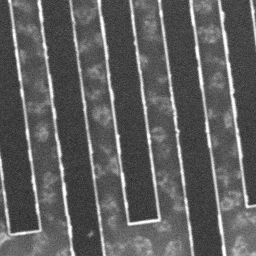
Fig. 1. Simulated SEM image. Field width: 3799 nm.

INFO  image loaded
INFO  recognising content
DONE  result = parallel lines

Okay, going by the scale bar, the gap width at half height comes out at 0.405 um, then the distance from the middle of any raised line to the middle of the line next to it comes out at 59.6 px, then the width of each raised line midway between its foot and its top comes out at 0.476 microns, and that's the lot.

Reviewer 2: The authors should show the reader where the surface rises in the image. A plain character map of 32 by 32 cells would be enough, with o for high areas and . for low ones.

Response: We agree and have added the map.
o....oooo...oooo....oooo...oooo.
o....oooo...ooooo...oooo....oooo
oo...oooo....oooo...oooo....oooo
oo...oooo....oooo...oooo....oooo
oo...oooo....oooo...ooooo...oooo
oo....oooo...oooo....oooo...oooo
oo....oooo...oooo....oooo...oooo
oo....oooo...oooo....oooo...oooo
oo....oooo...oooo....oooo...oooo
ooo...oooo...ooooo...oooo....ooo
ooo...oooo....oooo...oooo....ooo
ooo...oooo....oooo...oooo....ooo
ooo...ooooo...oooo....ooo....ooo
ooo....oooo...oooo....oooo...ooo
ooo....oooo...oooo....oooo...ooo
ooo....oooo...oooo....oooo...ooo
ooo....oooo....oooo...oooo....oo
oooo...oooo....oooo...oooo....oo
oooo...oooo....oooo...oooo....oo
oooo...oooo....oooo...ooooo...oo
oooo....oooo...oooo....oooo...oo
oooo....oooo...oooo....oooo...oo
oooo....oooo...oooo....oooo...oo
oooo....oooo...oooo....oooo...oo
.oooo...oooo....oooo...oooo....o
.oooo...oooo....oooo...oooo....o
.oooo...oooo....oooo...oooo.....
.oooo...ooooo...oooo....oooo....
.oooo....oooo...........oooo....
.........oooo...........oooo....
.........oooo...........oooo....
.........oooo...........oooo....